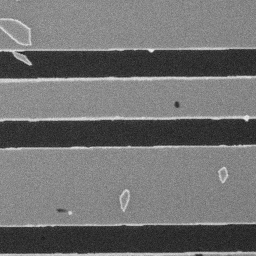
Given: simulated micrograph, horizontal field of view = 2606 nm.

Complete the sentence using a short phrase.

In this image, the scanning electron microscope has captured lines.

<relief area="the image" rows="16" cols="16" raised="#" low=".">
################
################
################
................
................
################
################
................
................
################
################
################
################
################
................
................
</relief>